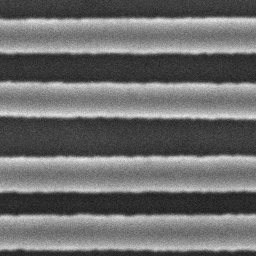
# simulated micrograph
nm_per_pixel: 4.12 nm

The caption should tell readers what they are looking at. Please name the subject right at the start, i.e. lines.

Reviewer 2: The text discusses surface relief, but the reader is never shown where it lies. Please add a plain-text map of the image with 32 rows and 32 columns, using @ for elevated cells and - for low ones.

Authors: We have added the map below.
--------------------------------
--------------------------------
@--@@@@-@@@@@@@@@@@@@@@@@@@@@@@@
@@@@@@@@@@@@@@@@@@@@@@@@@@@@@@@@
@@@@@@@@@@@@@@@@@@@@@@@@@@@@@@@@
@@@@@@@@@@@@@@@@@@@@@@@@@@@@@@@@
@@@@@@@@@@@@@@@@@@@@@@@@@@@@@@@@
--------------------------------
--------------------------------
--------------------------------
@@@@@@@@@@@@@@@@@@@@@@@@@@@-@@@@
@@@@@@@@@@@@@@@@@@@@@@@@@@@@@@@@
@@@@@@@@@@@@@@@@@@@@@@@@@@@@@@@@
@@@@@@@@@@@@@@@@@@@@@@@@@@@@@@@@
---@@-@@@@@@-@@@@@@@@@@@@@@@@@@@
--------------------------------
--------------------------------
--------------------------------
--------------------------------
--------------------------------
@@@@@@@@@@@@@@@@@@@@@@@@@@@@@@@@
@@@@@@@@@@@@@@@@@@@@@@@@@@@@@@@@
@@@@@@@@@@@@@@@@@@@@@@@@@@@@@@@@
@@@@@@@@@@@@@@@@@@@@@@@@@@@@@@@@
--------------------------------
--------------------------------
--------------------------------
@@@@@@@@@@@@@@@@@@@@@@@@@@@@@@@@
@@@@@@@@@@@@@@@@@@@@@@@@@@@@@@@@
@@@@@@@@@@@@@@@@@@@@@@@@@@@@@@@@
@@@@@@@@@@@@@@@@@@@@@@@@@@@@@@@@
--------------------------------